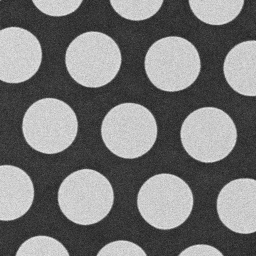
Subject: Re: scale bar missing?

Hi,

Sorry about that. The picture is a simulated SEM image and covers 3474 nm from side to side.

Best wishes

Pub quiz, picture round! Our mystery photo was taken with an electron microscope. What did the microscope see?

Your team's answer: an array of small figures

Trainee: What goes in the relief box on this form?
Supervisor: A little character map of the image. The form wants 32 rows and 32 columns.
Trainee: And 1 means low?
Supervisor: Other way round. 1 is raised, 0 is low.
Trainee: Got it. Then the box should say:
00001111110000111111000011111100
00000111100000011111000011111100
00000000000000000100000001111000
01100000000000000000000000000000
11110000001110000000000000000000
11111000011111100001111100000011
11111000111111100011111110000111
11111000111111100011111110001111
11111000111111100011111110001111
11110000011111000011111110001111
00000000001110000001111100000111
00000000000000000000000000000011
00000110000000000000000000000000
00001111100000111100000001000000
00011111100001111110000011111000
00011111110001111110000111111000
00011111110001111111000111111100
00011111100001111110000111111000
00001111000000111110000111111000
00000000000000011000000011110000
00000000000000000000000000000000
11100000011100000000000000000000
11110000111110000001111000000111
11110001111111000011111100001111
11110001111111000111111100011111
11110001111111000111111100011111
11100000111111000011111100011111
10000000011110000011111000001111
00000000000000000000110000000111
00000000000000000000000000000000
00011111000000111000000000000000
00111111000011111100000111100000